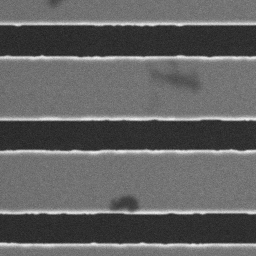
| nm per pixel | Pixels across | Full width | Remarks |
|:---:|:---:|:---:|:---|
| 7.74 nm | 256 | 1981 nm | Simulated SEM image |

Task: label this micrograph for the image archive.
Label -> lines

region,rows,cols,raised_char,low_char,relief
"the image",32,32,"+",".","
++++++++++++++++++++++++++++++++
++++++++++++++++++++++++++++++++
++++++++++++++++++++++++++++++++
................................
................................
................................
................................
++++++++++++++++++++++++++++++++
++++++++++++++++++++++++++++++++
++++++++++++++++++++++++++++++++
++++++++++++++++++++++++++++++++
++++++++++++++++++++++++++++++++
++++++++++++++++++++++++++++++++
++++++++++++++++++++++++++++++++
++++++++++++++++++++++++++++++++
................................
................................
................................
................................
++++++++++++++++++++++++++++++++
++++++++++++++++++++++++++++++++
++++++++++++++++++++++++++++++++
++++++++++++++++++++++++++++++++
++++++++++++++++++++++++++++++++
++++++++++++++++++++++++++++++++
++++++++++++++++++++++++++++++++
++++++++++++++++++++++++++++++++
................................
................................
................................
++.........+.....++.............
++++++++++++++++++++++++++++++++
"